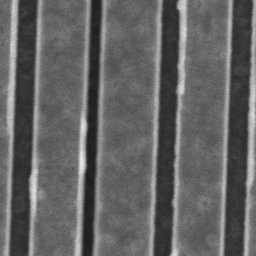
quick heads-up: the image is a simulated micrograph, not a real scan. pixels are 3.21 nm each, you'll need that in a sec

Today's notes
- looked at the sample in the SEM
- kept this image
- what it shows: one or a few lines or trenches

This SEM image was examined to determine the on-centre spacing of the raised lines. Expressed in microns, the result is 0.228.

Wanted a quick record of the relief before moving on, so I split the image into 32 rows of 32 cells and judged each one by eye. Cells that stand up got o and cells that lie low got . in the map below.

oo...oooooo..ooooooo..ooooooo...
oo...oooooo..ooooooo..ooooooo...
oo...oooooo..ooooooo...oooooo...
oo...oooooo..ooooooo...oooooo...
oo...oooooo..ooooooo...oooooo...
oo...oooooo..ooooooo...oooooo...
oo...oooooo..ooooooo...oooooo...
oo...oooooo..ooooooo..ooooooo...
oo...oooooo..ooooooo..ooooooo...
oo...oooooo..ooooooo...oooooo..o
oo...oooooo..ooooooo..ooooooo..o
oo...oooooo..ooooooo..oooooo...o
oo...oooooo.oooooooo..oooooo...o
oo...oooooo..ooooooo..oooooo...o
oo..ooooooo..ooooooo..oooooo...o
oo..ooooooo.ooooooo...oooooo...o
o...ooooooo.ooooooo...oooooo...o
o...ooooooo.ooooooo...oooooo...o
o...ooooooo.ooooooo...oooooo...o
o...ooooooo.ooooooo...oooooo...o
o...ooooooo.ooooooo...oooooo...o
o...ooooooo.ooooooo...oooooo...o
o...oooooo..ooooooo...oooooo...o
o...oooooo..ooooooo...oooooo...o
o...oooooo..ooooooo...oooooo...o
o...oooooo..ooooooo...oooooo...o
o...oooooo..ooooooo...oooooo...o
o...oooooo..ooooooo...oooooo...o
o...oooooo..ooooooo...oooooo...o
o...oooooo..ooooooo...oooooo...o
o...oooooo..ooooooo...oooooo...o
o...oooooo..ooooooo..ooooooo...o